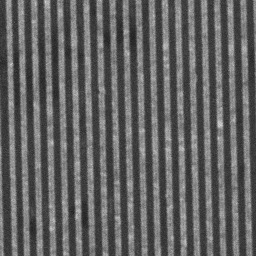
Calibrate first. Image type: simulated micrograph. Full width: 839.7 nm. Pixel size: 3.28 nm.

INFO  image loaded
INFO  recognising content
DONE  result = parallel lines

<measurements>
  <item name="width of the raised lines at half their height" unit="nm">15.2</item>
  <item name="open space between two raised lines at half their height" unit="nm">27.4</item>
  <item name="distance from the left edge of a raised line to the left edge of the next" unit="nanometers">42.7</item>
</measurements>